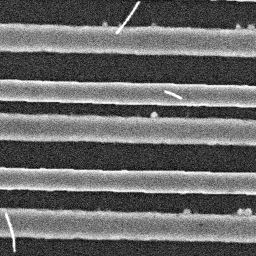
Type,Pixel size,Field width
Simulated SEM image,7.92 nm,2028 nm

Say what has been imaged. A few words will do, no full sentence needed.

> lines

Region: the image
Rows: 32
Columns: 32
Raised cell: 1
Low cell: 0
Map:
00000000000000000000000000000000
00000000000000000000000000000000
00000000000000000000000000000000
11111111111111110111100000000000
11111111111111111111111111111111
11111111111111111111111111111111
00000000000010111111111111111111
00000000000000000000000000000000
00000000000000000000000000000000
00000000000000000000000000000000
11111111111111111111110000000000
11111111111111111111111111111111
11111111111111111111111111111111
00000000000000000000000000000000
11100100000000000000000000000000
11111111111111111111111111111111
11111111111111111111111111111111
00000000000011111111111111111111
00000000000000000000000000000000
00000000000000000000000000000000
00000000000000000000000000000000
11111111111111111111111000000000
11111111111111111111111111111111
11111111111111111111111111111111
00000000000000000000000000000000
00000000000000000000000000000000
11111111111010000000000000000000
11111111111111111111111111111111
11111111111111111111111111111111
01001111111111111111111111111111
00000000000000000000000000000000
00000000000000000000000000000000